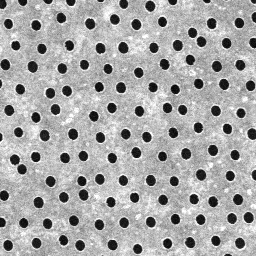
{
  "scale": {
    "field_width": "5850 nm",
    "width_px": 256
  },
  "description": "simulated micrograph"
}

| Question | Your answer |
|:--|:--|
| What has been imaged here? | a regular array of holes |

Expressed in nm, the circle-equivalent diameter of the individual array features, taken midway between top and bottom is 242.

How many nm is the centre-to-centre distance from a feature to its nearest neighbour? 498